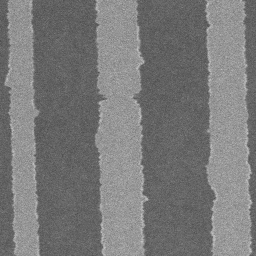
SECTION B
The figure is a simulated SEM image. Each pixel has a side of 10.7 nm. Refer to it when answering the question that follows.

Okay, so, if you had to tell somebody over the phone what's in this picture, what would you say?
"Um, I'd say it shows one or a few lines or trenches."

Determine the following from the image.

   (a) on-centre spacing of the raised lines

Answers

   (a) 1100 nanometers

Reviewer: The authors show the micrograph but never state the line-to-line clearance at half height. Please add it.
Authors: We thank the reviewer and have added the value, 706 nanometres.